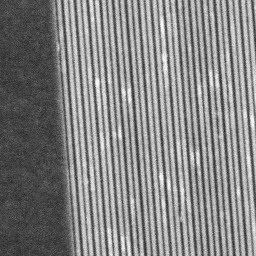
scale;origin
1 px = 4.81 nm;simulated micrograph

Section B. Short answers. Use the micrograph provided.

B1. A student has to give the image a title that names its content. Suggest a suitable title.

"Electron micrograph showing parallel lines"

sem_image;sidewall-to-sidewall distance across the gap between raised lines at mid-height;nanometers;12.6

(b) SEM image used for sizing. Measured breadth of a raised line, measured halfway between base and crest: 3.62 px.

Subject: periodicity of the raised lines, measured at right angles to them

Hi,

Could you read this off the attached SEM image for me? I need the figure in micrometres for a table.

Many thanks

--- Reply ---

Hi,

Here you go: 0.0304